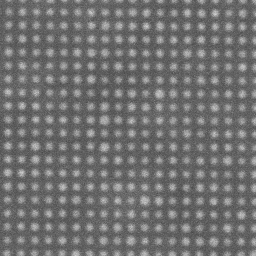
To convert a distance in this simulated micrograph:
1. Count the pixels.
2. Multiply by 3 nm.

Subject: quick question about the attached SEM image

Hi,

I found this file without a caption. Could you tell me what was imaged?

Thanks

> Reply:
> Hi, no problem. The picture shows a regular array of raised bodies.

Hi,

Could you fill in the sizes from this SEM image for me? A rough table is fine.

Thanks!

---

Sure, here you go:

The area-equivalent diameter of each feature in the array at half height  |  19.5 nm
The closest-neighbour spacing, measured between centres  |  13.3 px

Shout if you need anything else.